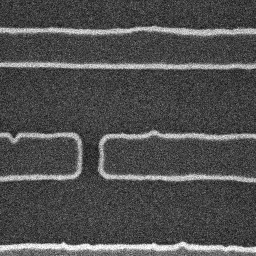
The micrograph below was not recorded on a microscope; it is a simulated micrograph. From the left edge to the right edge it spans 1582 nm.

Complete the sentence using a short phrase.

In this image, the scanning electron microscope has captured one or a few lines or trenches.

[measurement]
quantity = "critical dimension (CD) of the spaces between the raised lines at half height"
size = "0.428 µm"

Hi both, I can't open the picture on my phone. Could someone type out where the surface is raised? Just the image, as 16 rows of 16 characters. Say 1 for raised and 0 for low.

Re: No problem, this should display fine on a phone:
0000000000000000
0000000000000000
1111111111111111
1111111111111111
0000000000000000
0000000000000000
0000000000000000
0000000000000000
0101000011100000
1111101111111111
1111101111111111
0000000000000000
0000000000000000
0000000000000000
0000000000000000
1111111111111100